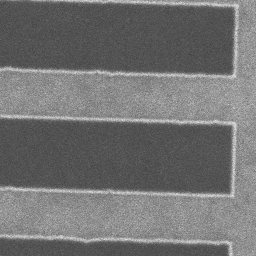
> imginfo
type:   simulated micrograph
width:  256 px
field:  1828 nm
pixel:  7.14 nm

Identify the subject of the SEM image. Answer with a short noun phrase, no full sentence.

one or a few lines or trenches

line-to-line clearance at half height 0.332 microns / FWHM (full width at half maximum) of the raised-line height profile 521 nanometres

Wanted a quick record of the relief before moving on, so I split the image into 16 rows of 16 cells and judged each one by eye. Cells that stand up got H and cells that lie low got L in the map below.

HHHHHHHHHHHHHHHL
HHHHHHHHHHHHHHHL
HHHHHHHHHHHHHHHL
HHHHHHHHHHHHHHHL
LLLLHHHHHHHHHHHL
LLLLLLLLLLLLLLLL
LLLLLLLLLLLLLLLL
HHHHHHHHLLLLLLLL
HHHHHHHHHHHHHHHL
HHHHHHHHHHHHHHHL
HHHHHHHHHHHHHHHL
HHHHHHHHHHHHHHHL
LLLLLLLLLLLLLLLL
LLLLLLLLLLLLLLLL
LLLLLLLLLLLLLLLL
HHHHHHHHHHHHHHLL